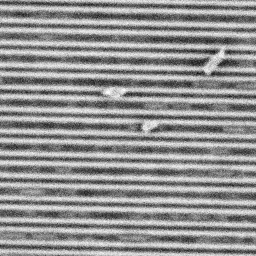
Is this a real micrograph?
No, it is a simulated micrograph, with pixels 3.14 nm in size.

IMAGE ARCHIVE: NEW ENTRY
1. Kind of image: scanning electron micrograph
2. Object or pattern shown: parallel lines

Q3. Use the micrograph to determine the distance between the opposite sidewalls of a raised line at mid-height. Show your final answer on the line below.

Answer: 0.0137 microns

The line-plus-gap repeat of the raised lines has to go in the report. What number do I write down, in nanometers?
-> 34.9